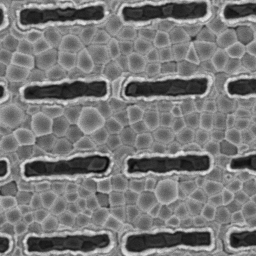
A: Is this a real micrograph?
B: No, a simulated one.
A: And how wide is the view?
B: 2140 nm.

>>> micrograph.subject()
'a regular array of holes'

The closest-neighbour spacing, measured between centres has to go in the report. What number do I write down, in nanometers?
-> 638